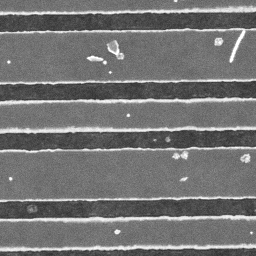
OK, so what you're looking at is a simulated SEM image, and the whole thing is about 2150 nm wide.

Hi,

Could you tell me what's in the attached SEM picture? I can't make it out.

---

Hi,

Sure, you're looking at lines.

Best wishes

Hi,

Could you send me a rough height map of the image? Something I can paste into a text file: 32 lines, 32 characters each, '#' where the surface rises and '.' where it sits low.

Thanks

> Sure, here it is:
################################
#################..##...........
................................
................................
################################
################################
################################
################################
################################
################################
................................
................................
.........................#######
################################
################################
################################
######..........................
................................
........................#..#####
################################
################################
################################
################################
################################
################################
................................
................................
################################
################################
################################
################################
................................